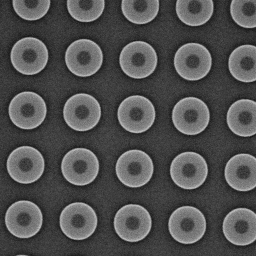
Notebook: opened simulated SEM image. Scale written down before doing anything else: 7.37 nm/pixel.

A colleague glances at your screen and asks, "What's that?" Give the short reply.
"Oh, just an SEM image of an array of small figures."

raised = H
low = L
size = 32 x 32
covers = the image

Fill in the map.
LLHHHHLLHHHHHLLHHHHHLLHHHHHLLHHH
LLHHHHLLLHHHHLLHHHHHLLHHHHHLLHHH
LLLLLLLLLLHHLLLLHHHLLLLHHHLLLHHH
LLLLLLLLLLLLLLLLLLLLLLLLLLLLLLLL
LLLLLLLLLLLLLLLLLLLLLLLLLLLLLLLL
LLHHHLLLLHHHLLLLHHLLLLLHHLLLLLLL
LHHHHHLLHHHHHLLHHHHLLLHHHHLLLHHH
LHHHHHLLHHHHHLLHHHHHLLHHHHLLLHHH
LLHHHLLLLHHHLLLHHHHLLLHHHHLLLHHH
LLLLLLLLLLHLLLLLHHLLLLLHHHLLLHHH
LLLLLLLLLLLLLLLLLLLLLLLLLLLLLLLL
LLLLLLLLLLLLLLLLLLLLLLLLLLLLLLLL
LLHHHLLLLHHHLLLLHHHLLLLHHLLLLLHL
LHHHHHLLHHHHHLLHHHHLLLHHHHLLLHHH
LHHHHHLLHHHHHLLHHHHLLLHHHHLLHHHH
LLHHHLLLHHHHLLLHHHHLLLHHHHLLHHHH
LLLLLLLLLLLLLLLLHHLLLLLHHLLLLHHH
LLLLLLLLLLLLLLLLLLLLLLLLLLLLLLLL
LLHHLLLLLLLLLLLLLLLLLLLLLLLLLLLL
LHHHHLLLHHHHLLLHHHLLLLHHHLLLLHHL
LHHHHLLLHHHHLLLHHHHLLHHHHHLLHHHH
LHHHHLLLHHHHLLLHHHHLLHHHHHLLHHHH
LLHHLLLLHHHHLLLHHHHLLLHHHHLLHHHH
LLLLLLLLLLLLLLLLLLLLLLLHLLLLLHHH
LLLLLLLLLLLLLLLLLLLLLLLLLLLLLLLL
LLHHLLLLLHHLLLLLLLLLLLLLLLLLLLLL
LHHHHLLLHHHHLLLHHHLLLLHHHLLLLHHH
LHHHHLLLHHHHLLHHHHHLLHHHHHLLHHHH
LHHHHLLLHHHHLLHHHHHLLHHHHHLLHHHH
LLHHLLLLHHHLLLLHHHLLLLHHHLLLHHHH
LLLLLLLLLLLLLLLLLLLLLLLLLLLLLHHL
LLLLLLLLLLLLLLLLLLLLLLLLLLLLLLLL